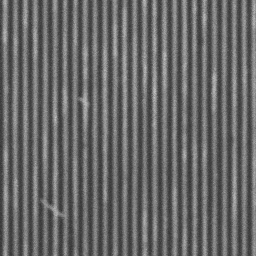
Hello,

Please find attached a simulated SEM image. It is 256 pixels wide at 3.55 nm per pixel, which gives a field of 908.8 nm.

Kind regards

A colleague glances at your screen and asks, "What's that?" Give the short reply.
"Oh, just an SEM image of parallel lines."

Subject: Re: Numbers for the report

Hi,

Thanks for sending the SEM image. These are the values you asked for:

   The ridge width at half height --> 13.3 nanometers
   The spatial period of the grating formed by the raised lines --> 35.3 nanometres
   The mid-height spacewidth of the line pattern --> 20.4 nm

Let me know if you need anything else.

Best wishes